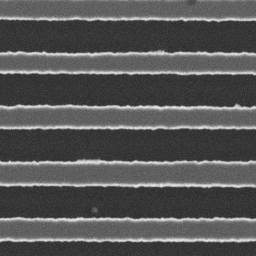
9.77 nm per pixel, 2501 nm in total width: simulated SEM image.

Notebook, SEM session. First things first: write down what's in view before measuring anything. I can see lines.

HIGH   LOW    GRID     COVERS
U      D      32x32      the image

UUUUUUUUUUUUUUUUUUUUUUUUUUUUUUUU
UUUUUUUUUUUUUUUUUUUUUUUUUUUUUUUU
DDDDUDUUUDUUDUUDUDUDUUUUUUUUUUUU
DDDDDDDDDDDDDDDDDDDDDDDDDDDDDDDD
DDDDDDDDDDDDDDDDDDDDDDDDDDDDDDDD
DDDDDDDDDDDDDDDDDDDDDDDDDDDDDDDD
DDUDDDDDDDDDDDDDUDDDDDUDDDDDDDDD
UUUUUUUUUUUUUUUUUUUUUUUUUUUUUUUU
UUUUUUUUUUUUUUUUUUUUUUUUUUUUUUUU
DDDDDDDDDDDDDDDDDDDDDDDDDDDDDDDD
DDDDDDDDDDDDDDDDDDDDDDDDDDDDDDDD
DDDDDDDDDDDDDDDDDDDDDDDDDDDDDDDD
DDDDDDDDDDDDDDDDDDDDDDDDDDDDDDDD
UUUUUUUUUUUUUUUUUUUUUUUUUUUUUUUU
UUUUUUUUUUUUUUUUUUUUUUUUUUUUUUUU
UUUUUUUUUUUUUUUUUUUUUUUUUUUUUUUU
DDDDDDDDDDDDDDDDDDDDDDDDDDDDDDDD
DDDDDDDDDDDDDDDDDDDDDDDDDDDDDDDD
DDDDDDDDDDDDDDDDDDDDDDDDDDDDDDDD
DDDDDDDDDDDDDDDDDDDDDDDDDDDDDDDD
UUUUUUUUUUUUUUUUUUUUUUUUUUUUUUUU
UUUUUUUUUUUUUUUUUUUUUUUUUUUUUUUU
UUUUUUUUUUUUUUUUUUUUUUUUUUUUUUUU
DDDDDDDDDDDDDDDDDDDDDDDDDDDDDDDD
DDDDDDDDDDDDDDDDDDDDDDDDDDDDDDDD
DDDDDDDDDDDDDDDDDDDDDDDDDDDDDDDD
DDDDDDDDDDDDDDDDDDDDDDDDDDDDDDDD
UUUUUUUUUUUUUUUUUUUUUUUUUUUUUUUU
UUUUUUUUUUUUUUUUUUUUUUUUUUUUUUUU
UUUUUUUUUUUUUUUUUUUUUUUUUUUUUUUU
DDDDDDDDDDDDDDDDDDDDDDDDDDDDDDDD
DDDDDDDDDDDDDDDDDDDDDDDDDDDDDDDD